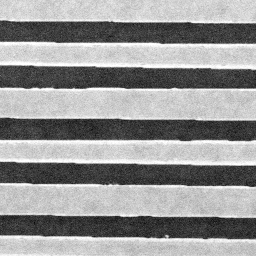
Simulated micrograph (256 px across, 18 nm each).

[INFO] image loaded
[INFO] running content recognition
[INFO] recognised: lines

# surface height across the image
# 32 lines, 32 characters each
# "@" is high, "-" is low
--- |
@@@@@@@@@@@@@@@@@@@@@@@@@@@@@@@@
@@@@@@@@@@@@@@@@@@@@@@@@@@@@@@@@
-@@@@@@@@@@@@@@@@@@@@@@@@@@@@@@@
--------------------------------
--------------------------------
@@@@@@@@@@@@@@@@@---------------
@@@@@@@@@@@@@@@@@@@@@@@@@@@@@@@@
@@@@@@@@@@@@@@@@@@@@@@@@@@@@@@@@
--------------------------------
--------------------------------
--------------------------------
@@@@@@@@@@@@@@@@@@@@@@@@@@@@@@@@
@@@@@@@@@@@@@@@@@@@@@@@@@@@@@@@@
@@@@@@@@@@@@@@@@@@@@@@@@@@@@@@@@
@@@@@@@@@@@@@@@@@@@@@@@@@@@@@@@@
--------------------------------
--------------------------------
--------------------------------
@@@@@@@@@@@@@@@@@@@@@@@@@@@@@@@@
@@@@@@@@@@@@@@@@@@@@@@@@@@@@@@@@
--------------------------------
--------------------------------
--------------------------------
@@@@@@@@@@@@@@@@@@@@@@@@@@@@@@@@
@@@@@@@@@@@@@@@@@@@@@@@@@@@@@@@@
@@@@@@@@@@@@@@@@@@@@@@@@@@@@@@@@
@@@@@@@@@@@@@@@@@@@@@@@@@@@@@@@@
--------------------------------
--------------------------------
--------------------------------
@@@@@@@@@@@@@@@@@@@@@@@@@@@@@@@@
@@@@@@@@@@@@@@@@@@@@@@@@@@@@@@@@